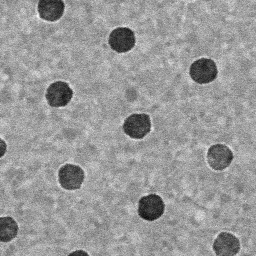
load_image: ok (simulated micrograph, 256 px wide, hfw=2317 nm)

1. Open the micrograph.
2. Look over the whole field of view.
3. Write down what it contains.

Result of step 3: holes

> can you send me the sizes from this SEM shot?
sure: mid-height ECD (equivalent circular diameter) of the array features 254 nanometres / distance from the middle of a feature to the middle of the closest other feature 0.756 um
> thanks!